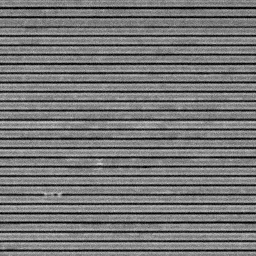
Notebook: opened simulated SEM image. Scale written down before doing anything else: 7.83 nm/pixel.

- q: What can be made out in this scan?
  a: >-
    parallel lines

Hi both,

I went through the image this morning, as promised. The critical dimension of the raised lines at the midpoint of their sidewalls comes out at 53.8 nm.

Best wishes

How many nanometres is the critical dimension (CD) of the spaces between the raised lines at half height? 20.5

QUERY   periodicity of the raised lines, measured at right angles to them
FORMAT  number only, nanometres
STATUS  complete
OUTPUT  73